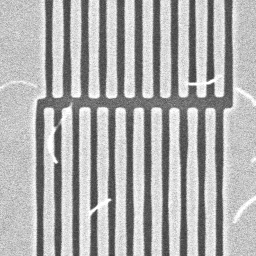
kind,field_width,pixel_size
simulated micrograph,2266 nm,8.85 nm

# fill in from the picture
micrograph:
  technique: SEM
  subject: groups of lines, slits or small figures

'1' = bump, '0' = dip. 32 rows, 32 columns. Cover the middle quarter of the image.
00110011100110011000110011000110
00110011100110011000110011000110
00110011100110011000110011000110
00110011100110011000110011000110
00110011100110011000110011000110
00110011100110011000110011000110
00110011100110011000110011000110
00110011100110011000110011000110
00000000000000000000000000000000
00000000000000000000000000000000
00000000000000000000000000000000
11001100111001100011001100010001
11001100111001100011001100111001
11001100111001100011001100111001
11001100111001100011001100111001
11001100011001100011001100111001
11001100011001100011001100111001
11001100011001100111001100111001
11001100011001100111001100111001
11001100011001100111001100111001
11001100011001100111001100111001
11001100111001100111001100111001
11001100111001100111001100111001
11001100111001100111001100111001
11001100111001100111001100111001
11001100111001100111001100111001
11001100111001100111001100111001
11001100111001100111001100111001
11001100011001100111001100111001
11001100011001100111001100111001
11001100011001100111001100111001
11001100011001100111001100111001